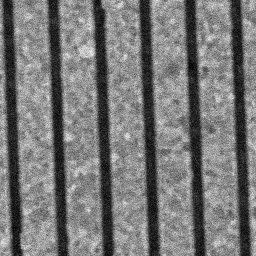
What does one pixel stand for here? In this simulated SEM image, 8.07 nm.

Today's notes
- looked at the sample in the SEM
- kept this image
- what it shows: parallel lines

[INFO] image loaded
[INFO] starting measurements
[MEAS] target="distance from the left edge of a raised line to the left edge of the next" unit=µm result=0.369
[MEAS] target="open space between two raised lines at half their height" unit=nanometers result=120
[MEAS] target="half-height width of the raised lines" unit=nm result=248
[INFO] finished